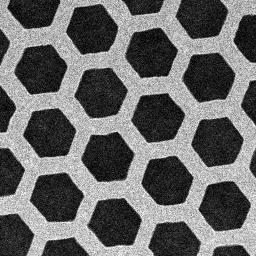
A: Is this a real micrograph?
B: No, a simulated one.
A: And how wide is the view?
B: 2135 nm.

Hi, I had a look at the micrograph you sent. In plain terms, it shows a regular array of holes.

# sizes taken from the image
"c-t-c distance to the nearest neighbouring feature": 0.524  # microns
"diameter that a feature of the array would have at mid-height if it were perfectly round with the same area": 49.7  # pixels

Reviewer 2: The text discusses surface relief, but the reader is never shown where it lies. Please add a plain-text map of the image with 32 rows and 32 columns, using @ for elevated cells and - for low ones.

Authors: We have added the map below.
@------@@@@@@@@@----@@@-----@@@@
@------@@----@@@----@@------@@@@
@@-----@@-----@@@@@@@@------@@--
@@@--@@@-------@@@@@@@@-----@@--
-@@@@@@@@------@-----@@@---@@---
-@@@@@@@@-----@@------@@@@@@@---
-@@----@@@---@@@------@@@@@@@@--
@@@-----@@@@@@@@------@@----@@@-
@@------@@@@@-@@@----@@------@@@
@@------@@-----@@----@@------@@@
@@@-----@@-----@@@@@@@@------@@-
-@@@---@@-------@@@@@@@@-----@@-
-@@@@@@@@@------@-----@@@--@@@--
--@@@@@@@@-----@@------@@@@@@@--
--@@----@@@---@@@------@@@@@@@@-
-@@------@@@@@@@@------@@----@@@
@@@------@@@@@@@@-----@@------@@
@@@------@@-----@@---@@@------@@
@@@@-----@@-----@@@@@@@@------@@
--@@@---@@-------@@@@-@@@-----@-
---@@@@@@@------@@-----@@@---@@-
---@@@@@@@@-----@@------@@@@@@@-
---@@----@@@---@@@------@@@@@@@@
--@@------@@@@@@@@------@@----@@
-@@@------@@@@@@@@@----@@------@
@@@@------@@----@@@@--@@@------@
@@@@@-----@@-----@@@@@@@@------@
---@@@---@@-------@@@@@@@@-----@
----@@@@@@@------@@-----@@@---@@
----@@@@@@@@-----@@-----@@@@@@@@
----@@----@@@---@@@------@@@@@@@
----@------@@@@@@@@------@@----@